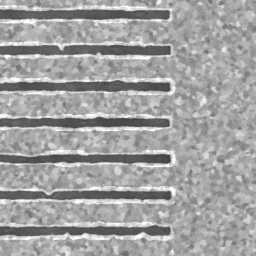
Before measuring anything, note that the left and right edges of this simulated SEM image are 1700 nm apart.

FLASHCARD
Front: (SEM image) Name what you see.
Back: parallel lines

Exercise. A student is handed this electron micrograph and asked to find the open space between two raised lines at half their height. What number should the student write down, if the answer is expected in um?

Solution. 0.0672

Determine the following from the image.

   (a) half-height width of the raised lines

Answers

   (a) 0.171 micrometres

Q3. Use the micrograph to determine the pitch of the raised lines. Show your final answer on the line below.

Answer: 240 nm